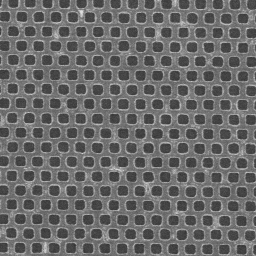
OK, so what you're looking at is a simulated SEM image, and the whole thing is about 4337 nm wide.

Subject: a regular array of holes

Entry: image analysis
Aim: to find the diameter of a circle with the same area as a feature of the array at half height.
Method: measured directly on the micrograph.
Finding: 194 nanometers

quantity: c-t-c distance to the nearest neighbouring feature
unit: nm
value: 277